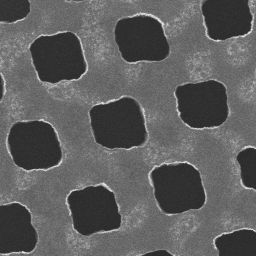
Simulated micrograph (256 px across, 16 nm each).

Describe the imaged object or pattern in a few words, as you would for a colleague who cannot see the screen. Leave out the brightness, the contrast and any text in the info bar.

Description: holes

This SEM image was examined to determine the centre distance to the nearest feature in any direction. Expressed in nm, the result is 1380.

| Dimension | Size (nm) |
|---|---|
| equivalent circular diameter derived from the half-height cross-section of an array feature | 837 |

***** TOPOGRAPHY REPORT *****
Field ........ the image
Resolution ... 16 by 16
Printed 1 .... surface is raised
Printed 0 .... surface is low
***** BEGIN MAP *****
0011111111111000
1111111000111000
1100011000111111
1100011100111111
1100011111111111
1111111111100011
1111111001100011
1111110001100011
1000110001111111
1000111111111110
1001111111001110
1111111111000110
1111000111000111
0011000111111111
0011101111111110
0011111111111100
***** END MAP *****